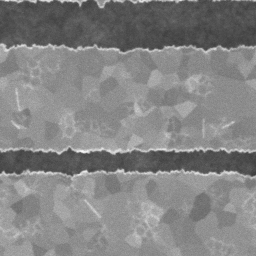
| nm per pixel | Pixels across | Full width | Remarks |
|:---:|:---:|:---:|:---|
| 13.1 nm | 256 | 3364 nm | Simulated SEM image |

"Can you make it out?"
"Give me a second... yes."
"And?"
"one or a few lines or trenches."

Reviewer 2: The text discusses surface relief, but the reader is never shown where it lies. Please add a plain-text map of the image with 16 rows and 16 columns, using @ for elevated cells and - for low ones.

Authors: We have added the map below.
----------------
----------------
----------------
@@@@@@@@@@@@@@@@
@@@@@@@@@@@@@@@@
@@@@@@@@@@@@@@@@
@@@@@@@@@@@@@@@@
@@@@@@@@@@@@@@@@
@@@@@@@@@@@@@@@@
-------@--------
----------------
@@@@@@@@@@@@@@@@
@@@@@@@@@@@@@@@@
@@@@@@@@@@@@@@@@
@@@@@@@@@@@@@@@@
@@@@@@@@@@@@@@@@